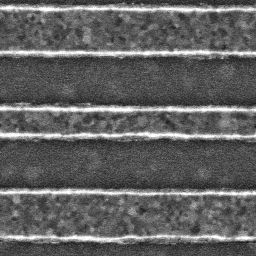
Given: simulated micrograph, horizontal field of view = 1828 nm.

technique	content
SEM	one or a few lines or trenches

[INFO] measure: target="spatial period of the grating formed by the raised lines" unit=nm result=658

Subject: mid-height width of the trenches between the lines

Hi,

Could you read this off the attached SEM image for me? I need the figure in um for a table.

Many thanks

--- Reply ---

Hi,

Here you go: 0.405